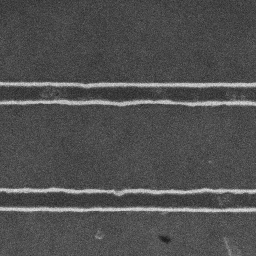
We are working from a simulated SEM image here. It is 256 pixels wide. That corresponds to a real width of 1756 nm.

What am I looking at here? one or a few lines or trenches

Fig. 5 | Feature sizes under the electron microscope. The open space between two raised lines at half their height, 0.601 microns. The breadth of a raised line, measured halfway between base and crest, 129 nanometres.